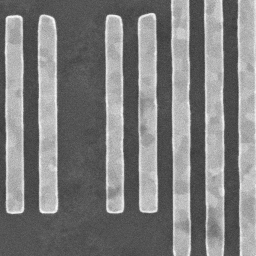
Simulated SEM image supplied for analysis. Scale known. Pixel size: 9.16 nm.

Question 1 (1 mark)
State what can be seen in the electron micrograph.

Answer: wiring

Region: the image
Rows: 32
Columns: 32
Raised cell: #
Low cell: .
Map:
.....................###..##..##
.....................###..##..##
.##..##......##..##...##..##..##
.##..##......##..##...##..##..##
.##..##......##..##..###..##..##
.##..##......##..##..###..##..##
.##..##......##..##...##..##..##
.##..##......##..##...##..##..##
.##..##......##..##...##..##..##
.##..##......##..##...##..##..##
.##..##......##..##...##..##..##
.##..##......##..##...##..##..##
.##..##......##..##...##..##..##
.##..##......##..###..##..##..##
.##..##......##..###..##..##..##
.##..##......##..###..##..##..##
.##..##......##..###..##..##..##
.##..##......##..###..##..##..##
.##..##......##..###..##..##..##
.##..##......##..###..##..##..##
.##..##......##..###..##..##..##
.##..##......##..###..##..##..##
.##..##......##..###..##..##..##
.##..##......##..###..##..##..##
.##..##......##..###..##..##..##
.##..##......##..###..##..##..##
.##..##.......#.......##..##..##
......................##..##..##
......................##..##..##
......................##..##..##
......................##..##..##
......................##..##..##